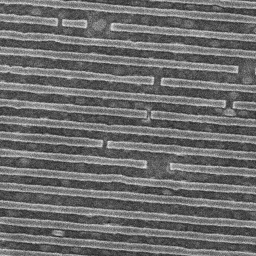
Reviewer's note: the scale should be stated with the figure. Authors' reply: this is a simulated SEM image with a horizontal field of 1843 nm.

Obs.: parallel lines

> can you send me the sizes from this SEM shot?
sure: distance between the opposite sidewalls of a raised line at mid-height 0.052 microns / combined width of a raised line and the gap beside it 121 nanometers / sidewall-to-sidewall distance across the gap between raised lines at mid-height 0.0681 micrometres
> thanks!